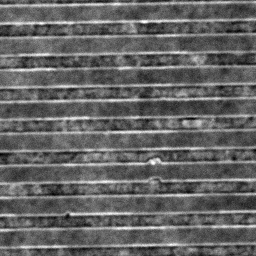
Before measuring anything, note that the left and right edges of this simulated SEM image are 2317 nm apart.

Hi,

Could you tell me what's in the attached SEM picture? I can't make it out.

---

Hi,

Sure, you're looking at parallel lines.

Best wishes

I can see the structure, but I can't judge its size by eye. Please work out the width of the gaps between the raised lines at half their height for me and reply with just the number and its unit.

122 nm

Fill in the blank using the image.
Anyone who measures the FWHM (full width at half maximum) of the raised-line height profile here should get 171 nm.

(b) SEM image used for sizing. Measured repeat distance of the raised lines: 289 nm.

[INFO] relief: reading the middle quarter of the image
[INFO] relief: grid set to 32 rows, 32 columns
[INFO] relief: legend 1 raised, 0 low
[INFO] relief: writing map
00000000000000000000000000000000
11111111111111111111111111111111
11111111111111111111111111111111
11111111111111111111111111111111
11111111111111111111111111111111
11111111110000000000000000000000
00000000000000000000000000000000
00000000000000000000000000000000
00000000000000000000000000000000
11111111111111111111111111111111
11111111111111111111111111111111
11111111111111111111111111111111
11111111111111111111111111111111
11111111111111100100000000000000
00000000000000000000000000000011
00000000000000000000000000000000
00000000000000000000000000000000
11111111111111111111111111111111
11111111111111111111111111111111
11111111111111111111111111111111
11111111111111111111111111111111
11111110000000000000000000000000
00000000000000000000000000000000
00000000000000000000000000000000
00000000000000000000011100000000
11111111111111111111111111111111
11111111111111111111111111111111
11111111111111111111111111111111
11111111111111111111110011111111
11111111111100000000000000000000
00000000000000000000000000000000
00000000000000000000000000000000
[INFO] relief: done